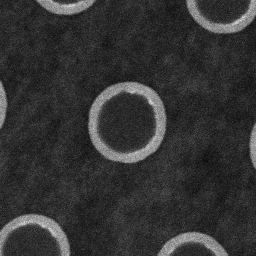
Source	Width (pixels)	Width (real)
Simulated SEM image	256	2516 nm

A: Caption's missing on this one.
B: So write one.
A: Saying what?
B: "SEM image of raised bodies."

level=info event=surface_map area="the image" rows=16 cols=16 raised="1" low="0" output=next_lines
0001100000001111
0000000000000110
0000000000000000
0000000000000000
0000000000000000
0000000110000000
0000001111000000
0000001111000000
0000001111000000
0000000110000000
0000000000000000
0000000000000000
0000000000000000
0000000000000000
1111000000000000
1111000000011100